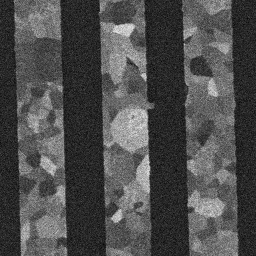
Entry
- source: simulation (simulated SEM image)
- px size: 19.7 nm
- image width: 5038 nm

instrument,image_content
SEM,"one or a few lines or trenches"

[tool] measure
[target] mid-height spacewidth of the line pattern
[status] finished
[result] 770 nm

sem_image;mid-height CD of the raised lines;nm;888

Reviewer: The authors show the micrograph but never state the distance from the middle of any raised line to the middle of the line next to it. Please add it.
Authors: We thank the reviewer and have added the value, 1670 nm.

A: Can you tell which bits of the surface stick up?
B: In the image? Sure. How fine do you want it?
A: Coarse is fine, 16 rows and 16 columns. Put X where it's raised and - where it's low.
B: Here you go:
-XXX--XXX--XXX--
-XXX--XXX--XXXX-
-XXX--XXX--XXXX-
-XXX--XXX---XXX-
-XXX--XXX---XXX-
-XXX--XXX---XXX-
-XXX--XXX---XXX-
-XXX--XXX---XXX-
-XXX--XXX---XXX-
-XXX--XXX---XXX-
-XXX---XX---XXX-
-XXX---XX---XXX-
-XXX---XX---XXX-
-XXX---XX---XXX-
-XXX---XX---XXX-
-XXX---XX---XXX-